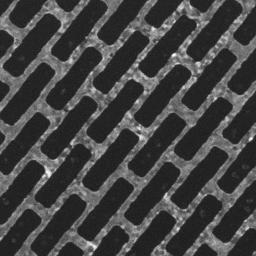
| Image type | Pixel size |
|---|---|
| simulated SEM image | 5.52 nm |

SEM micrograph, a regular array of holes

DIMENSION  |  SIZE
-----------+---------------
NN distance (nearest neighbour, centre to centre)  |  269 nanometers